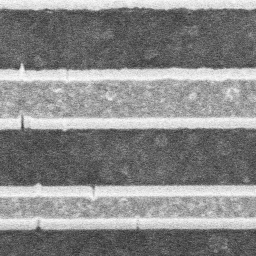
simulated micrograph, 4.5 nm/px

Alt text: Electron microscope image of one or a few lines or trenches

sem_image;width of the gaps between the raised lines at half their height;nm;307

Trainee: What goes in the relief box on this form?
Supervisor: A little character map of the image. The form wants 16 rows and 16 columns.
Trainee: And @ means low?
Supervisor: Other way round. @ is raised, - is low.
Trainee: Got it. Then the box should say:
----------------
----------------
----------------
----------------
----------------
@@@@@@@@@@@@@@@@
@@@@@@@@@@@@@@@@
@@@@@@@@@@@@@@@@
----------------
----------------
----------------
----------------
@@@@@@@@@@@@@@@@
@@@@@@@@@@@@@@@@
----------------
----------------